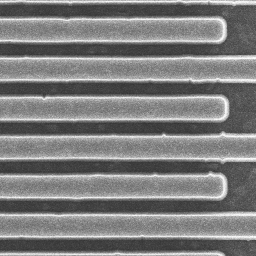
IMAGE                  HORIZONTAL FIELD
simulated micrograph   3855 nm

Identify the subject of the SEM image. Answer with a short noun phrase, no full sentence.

parallel lines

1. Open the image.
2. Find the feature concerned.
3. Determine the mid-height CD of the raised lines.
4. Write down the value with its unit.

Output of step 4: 382 nm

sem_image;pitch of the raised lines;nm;590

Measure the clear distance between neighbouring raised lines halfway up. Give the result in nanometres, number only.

205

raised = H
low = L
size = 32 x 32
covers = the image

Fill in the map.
LLLLLLLLHLLLLLLLLLLLLLLLLLLLLLLL
LLLLLLLLLLLLLLLLLLLLLLLLLLLLLLLL
HHHHHHHHHHHHHHHHHHHHHHHHHHHHLLLL
HHHHHHHHHHHHHHHHHHHHHHHHHHHHLLLL
HHHHHHHHHHHHHHHHHHHHHHHHHHHHLLLL
LLLLLLLLLLLLLLLLLLLLLLLLLLLLLLLL
LLLLLLLLLLLLLLLLLLLLLLLLLLLLLLLL
HHHHHHHHHHHHHHHHHHHHHHHHHHHHHHHH
HHHHHHHHHHHHHHHHHHHHHHHHHHHHHHHH
HHHHHHHHHHHHHHHHHHHHHHHHHHHHHHHH
LLLLLLLLLLLLLLLLLLLLLLLLLLLLLLLL
LLLLLLLLLLLLLLLLLLLLLLLLLLLLLLLL
HHHHHHHHHHHHHHHHHHHHHHHHHHHHLLLL
HHHHHHHHHHHHHHHHHHHHHHHHHHHHLLLL
HHHHHHHHHHHHHHHHHHHHHHHHHHHHLLLL
LLLLLLLLLLLLLLLLLLLLLLLLLLLLLLLL
LLLLLLLLLLLLLLLLLLLLLLLLLLLLLLLL
HHHHHHHHHHHHHHHHHHHHHHHHHHHHHHHH
HHHHHHHHHHHHHHHHHHHHHHHHHHHHHHHH
HHHHHHHHHHHHHHHHHHHHHHHHHHHHHHHH
LLLLLLLLLLLLLLLLLLLLLLLLLLLLLLLL
LLLLLLLLLLLLLLLLLLLLLLLLLLLLLLLL
HHHHHHHHHHHHHHHHHHHHHHHHHHHHLLLL
HHHHHHHHHHHHHHHHHHHHHHHHHHHHLLLL
HHHHHHHHHHHHHHHHHHHHHHHHHHHHLLLL
LLLLLLLLLLLLLLLLLLLLLLLLLLLLLLLL
LLLLLLLLLLLLLLLLLLLLLLLLLLLLLLLL
HHHHHHHHHHHHHHHHHHHHHHHHHHHHHHHH
HHHHHHHHHHHHHHHHHHHHHHHHHHHHHHHH
HHHHHHHHHHHHHHHHHHHHHHHHHHHHHHHH
LLLLLLLLLLLLLLLLLLLLLLLLLLLLLLLL
LLLLLLLLLLLLLLHLLLLLLLLLLLLLLLLL